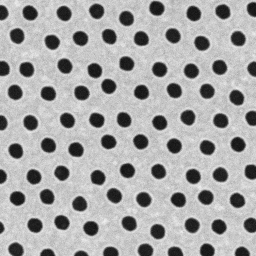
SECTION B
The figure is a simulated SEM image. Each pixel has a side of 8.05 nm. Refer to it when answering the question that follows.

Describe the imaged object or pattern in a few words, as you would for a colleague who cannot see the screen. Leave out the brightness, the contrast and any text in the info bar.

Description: a regular array of holes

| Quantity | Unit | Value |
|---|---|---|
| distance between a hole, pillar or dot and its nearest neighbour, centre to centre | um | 0.218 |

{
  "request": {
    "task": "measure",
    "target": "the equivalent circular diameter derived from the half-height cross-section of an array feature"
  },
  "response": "124 nm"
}